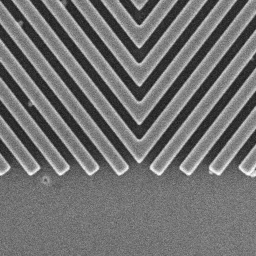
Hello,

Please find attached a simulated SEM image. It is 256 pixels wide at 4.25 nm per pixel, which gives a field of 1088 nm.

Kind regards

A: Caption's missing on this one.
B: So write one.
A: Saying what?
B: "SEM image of groups of lines, slits or small figures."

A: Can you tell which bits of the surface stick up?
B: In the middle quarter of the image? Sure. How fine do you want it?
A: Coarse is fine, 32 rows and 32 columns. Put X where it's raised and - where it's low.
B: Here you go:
XXXX---XXXX----XXXXXXXX---XXXX--
-XXXX---XXXX---XXXXXXX---XXXXX--
-XXXXX---XXXX---XXXXX----XXXX---
--XXXX----XXXX---XXXX---XXXX---X
---XXXX---XXXXX---XX---XXXX---XX
----XXXX---XXXX-------XXXXX---XX
X----XXXX---XXXX-----XXXXX---XXX
XX---XXXXX---XXXX----XXXX---XXXX
XXX---XXXX---XXXXX--XXXX---XXXXX
XXXX---XXXX---XXXXXXXXXX---XXXX-
XXXXX---XXXX---XXXXXXXX---XXXX--
-XXXX---XXXXX---XXXXXX---XXXX---
--XXXX---XXXX---XXXXX---XXXXX---
--XXXXX---XXXX---XXX----XXXX---X
---XXXX----XXXX---XX---XXXX---XX
X---XXXX---XXXXX------XXXX---XXX
XX---XXXX---XXXXX----XXXX----XXX
XX---XXXXX---XXXX---XXXXX---XXXX
XXX---XXXXX---XXXX--XXXX---XXXX-
XXXX---XXXX----XXXXXXXX---XXXX--
XXXXX---XXXX---XXXXXXX---XXXXX--
-XXXXX---XXXX---XXXXX----XXXX---
--XXXX----XXXX---XXXX---XXXX---X
---XXXX---XXXXX---XX---XXXX---XX
----XXXX---XXXX---X---XXXXX---XX
X---XXXXX---XXXX------XXXX---XXX
X----XXX-----XXX------XXX----XXX
------X------X---------X-------X
--------------------------------
--------------------------------
--------------------------------
--------------------------------